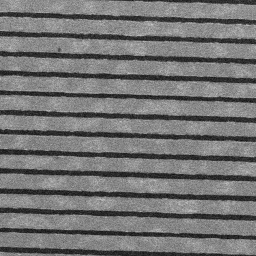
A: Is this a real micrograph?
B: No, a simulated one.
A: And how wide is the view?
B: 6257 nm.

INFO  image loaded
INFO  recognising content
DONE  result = parallel lines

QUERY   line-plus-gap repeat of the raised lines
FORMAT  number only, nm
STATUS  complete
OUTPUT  478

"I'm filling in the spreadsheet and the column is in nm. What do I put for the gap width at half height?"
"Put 134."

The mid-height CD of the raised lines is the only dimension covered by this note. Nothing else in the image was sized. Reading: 0.357 microns